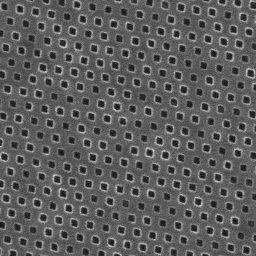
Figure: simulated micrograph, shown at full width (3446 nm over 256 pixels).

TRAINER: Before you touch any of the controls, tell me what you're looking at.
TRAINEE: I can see a regular array of holes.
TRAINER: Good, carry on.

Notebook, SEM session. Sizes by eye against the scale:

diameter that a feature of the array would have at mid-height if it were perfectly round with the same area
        98.4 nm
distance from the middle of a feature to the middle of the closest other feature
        208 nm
